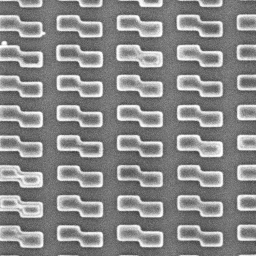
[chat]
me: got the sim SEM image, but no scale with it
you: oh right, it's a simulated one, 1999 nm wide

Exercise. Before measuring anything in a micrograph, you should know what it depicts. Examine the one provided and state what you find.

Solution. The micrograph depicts wiring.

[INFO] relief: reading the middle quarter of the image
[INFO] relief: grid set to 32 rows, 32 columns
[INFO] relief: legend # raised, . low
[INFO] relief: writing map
....#####..........#####........
................................
................................
####.........######.........####
#########....###########....####
#########....############...####
#########.....###########.......
....#####..........######.......
................................
................................
###...........#####..........###
####.........######.........####
#########....############...####
#########....############....###
....#####..........######.......
....#####..........#####........
................................
................................
####.........######.........####
#####........#######........####
##########...############...####
##########....###########....###
....######.........######.......
................................
................................
..............####...........###
####.........######..........###
#########....############....###
##########...############....###
....######.........######.......
....#####.......................
................................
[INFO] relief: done